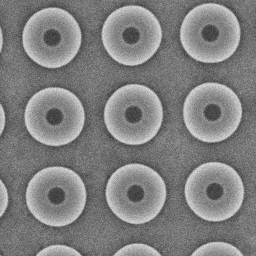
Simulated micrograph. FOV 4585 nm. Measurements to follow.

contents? an array of small figures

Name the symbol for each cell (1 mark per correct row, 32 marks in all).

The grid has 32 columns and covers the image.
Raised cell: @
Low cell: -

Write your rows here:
--------------------------@-----
-----@@@------@@@@@-----@@@@@---
----@@@@@----@@@@@@@---@@@@@@@--
---@@@@@@@---@@@@@@@---@@@@@@@--
---@@@@@@@---@@@@@@@---@@@@@@@--
---@@@@@@@---@@@@@@@---@@@@@@@--
---@@@@@@@---@@@@@@----@@@@@@---
----@@@@@-----@@@@-------@@@----
--------------------------------
--------------------------------
-------------------------@@@----
-----@@@@-----@@@@@-----@@@@@---
----@@@@@@----@@@@@@---@@@@@@@--
---@@@@@@@---@@@@@@@---@@@@@@@--
@--@@@@@@@@--@@@@@@@---@@@@@@@--
@--@@@@@@@---@@@@@@@---@@@@@@@--
----@@@@@@----@@@@@@----@@@@@---
-----@@@@------@@@@------@@@----
--------------------------------
--------------------------------
--------------------------@@----
-----@@@@-----@@@@@-----@@@@@@--
----@@@@@@----@@@@@@---@@@@@@@--
@--@@@@@@@@--@@@@@@@@--@@@@@@@--
@--@@@@@@@@--@@@@@@@@--@@@@@@@--
@--@@@@@@@@---@@@@@@----@@@@@@--
----@@@@@@----@@@@@@----@@@@@@--
-----@@@@------@@@@-------@@----
--------------------------------
--------------------------------
--------------------------@@@---
-----@@@@@-----@@@@@----@@@@@@--